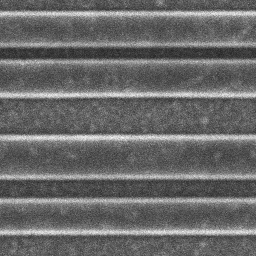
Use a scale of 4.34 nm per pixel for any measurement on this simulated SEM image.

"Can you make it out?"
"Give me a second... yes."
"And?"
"one or a few lines or trenches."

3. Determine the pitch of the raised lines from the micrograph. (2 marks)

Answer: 270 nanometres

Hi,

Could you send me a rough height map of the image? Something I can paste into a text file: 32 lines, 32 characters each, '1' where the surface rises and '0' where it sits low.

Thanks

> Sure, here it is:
00000000000000000000000000000000
00000000000000000000000000000000
11111111111111111111111111111111
11111111111111111111111111111111
11111111111111111111111111111111
11111111111111111111111111111111
00000000000000000000000000000000
00000000000000000000000000000001
11111111111111111111111111111111
11111111111111111111111111111111
11111111111111111111111111111111
11111111111111111111111111111111
00000000000000000000000000000000
00000000000000000000000000000000
00000000000000000000000000000000
00000000000000000000000000000000
00000000000000000000000000000000
11111111111111111111111111111111
11111111111111111111111111111111
11111111111111111111111111111111
11111111111111111111111111111111
11111111111111111111111111111111
00000000000000000000000000000000
00000000000000000000000000000000
00000000000000000000000000000000
11111111111111111111111111111111
11111111111111111111111111111111
11111111111111111111111111111111
11111111111111111111111111111111
00000000000000000000000000000000
00000000000000000000000000000000
00000000000000000000000000000000